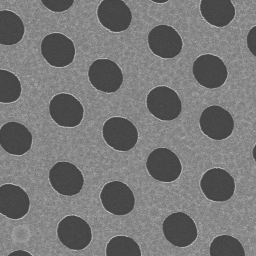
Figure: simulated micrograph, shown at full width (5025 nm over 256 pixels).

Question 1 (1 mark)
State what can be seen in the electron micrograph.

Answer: a regular array of holes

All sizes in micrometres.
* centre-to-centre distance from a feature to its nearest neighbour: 1.06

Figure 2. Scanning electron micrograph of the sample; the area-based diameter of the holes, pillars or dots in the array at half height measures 669 nanometers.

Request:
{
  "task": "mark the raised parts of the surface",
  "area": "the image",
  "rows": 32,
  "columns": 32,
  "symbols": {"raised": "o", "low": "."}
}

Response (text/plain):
ooooo....oooo...ooooooooo....ooo
..oooooooooo....ooooooooo....ooo
...ooooooooo....oooooooooo...ooo
...oooooooooo...ooo...oooooooooo
...ooo..ooooooooooo...ooooooooo.
..ooo....oooooooooo....oooooooo.
ooooo....oooooooooo...ooooooooo.
oooooo...ooo..oooooooooo....oooo
ooooooooooo....ooooooooo....oooo
..ooooooooo....ooooooooo....oooo
...oooooooo....oooooooooo...oooo
...oooooooooo.ooooo...oooooooooo
..oooo....oooooooo.....ooooooooo
oooooo....oooooooo.....ooo..oooo
oooooo....ooooooooo...ooo....ooo
o..oooo...ooo....oooooooo....ooo
....ooooooooo....oooooooo....ooo
....ooooooooo....ooooooooooooooo
....oooooooooo..oooooooooooooooo
ooooooooooooooooooo...oooooooooo
ooooooo..ooooooooo.....ooooooooo
oooooo....ooooooooo....ooo..oooo
oooooo....oooooooooo..ooo....ooo
...oooo...ooo...ooooooooo....ooo
...oooooooooo....ooooooooo...ooo
....ooooooooo....ooooooooooooooo
...ooooooooooo..oooooooooooooooo
oooooooo..ooooooooooo...oooooooo
ooooooo....ooooooooo.....ooooooo
ooooooo....oooooooooo....oo..ooo
oooooooo...oo....ooooo..oo....oo
oo.oooooooooo.....oooooooo.....o